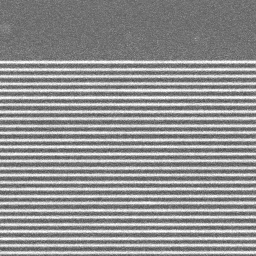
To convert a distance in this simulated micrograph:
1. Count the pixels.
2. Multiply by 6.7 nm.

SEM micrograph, parallel lines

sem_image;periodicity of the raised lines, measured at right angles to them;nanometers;47.2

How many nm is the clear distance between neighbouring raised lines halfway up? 36.9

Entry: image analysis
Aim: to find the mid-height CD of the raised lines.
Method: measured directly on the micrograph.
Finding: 12.6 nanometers